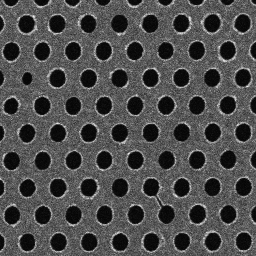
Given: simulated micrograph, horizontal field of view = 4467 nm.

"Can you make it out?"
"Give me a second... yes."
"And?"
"a regular array of holes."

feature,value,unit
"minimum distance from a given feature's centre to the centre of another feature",535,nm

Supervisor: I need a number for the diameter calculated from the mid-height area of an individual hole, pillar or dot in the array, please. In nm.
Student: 304